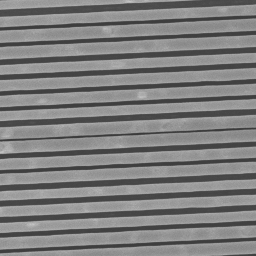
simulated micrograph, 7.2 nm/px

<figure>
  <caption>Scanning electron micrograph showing parallel lines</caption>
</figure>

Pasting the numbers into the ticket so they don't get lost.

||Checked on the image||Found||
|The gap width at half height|37.8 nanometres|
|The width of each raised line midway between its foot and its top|82.7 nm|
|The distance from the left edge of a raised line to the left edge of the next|114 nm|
